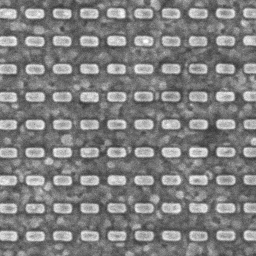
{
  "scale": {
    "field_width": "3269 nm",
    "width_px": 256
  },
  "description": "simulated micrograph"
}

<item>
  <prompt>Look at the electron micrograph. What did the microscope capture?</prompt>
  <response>a regular array of raised bodies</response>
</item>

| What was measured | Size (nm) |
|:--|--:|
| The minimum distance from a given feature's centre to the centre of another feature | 346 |